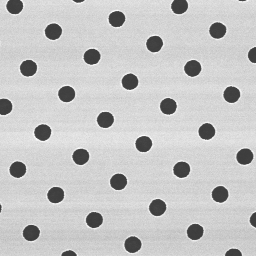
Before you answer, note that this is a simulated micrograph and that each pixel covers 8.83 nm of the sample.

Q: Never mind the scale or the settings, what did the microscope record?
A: a regular array of holes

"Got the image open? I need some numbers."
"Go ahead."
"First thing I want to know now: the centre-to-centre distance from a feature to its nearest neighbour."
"398 nm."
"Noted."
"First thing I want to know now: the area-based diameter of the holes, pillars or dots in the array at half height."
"0.148 micrometres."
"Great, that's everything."